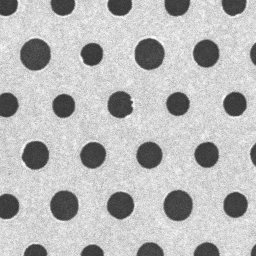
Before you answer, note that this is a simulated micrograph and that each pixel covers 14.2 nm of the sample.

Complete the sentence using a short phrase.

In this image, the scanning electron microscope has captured a regular array of holes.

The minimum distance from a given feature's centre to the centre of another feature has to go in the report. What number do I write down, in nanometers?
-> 806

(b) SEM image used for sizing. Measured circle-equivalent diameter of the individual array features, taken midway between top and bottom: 382 nanometers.